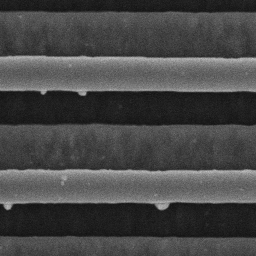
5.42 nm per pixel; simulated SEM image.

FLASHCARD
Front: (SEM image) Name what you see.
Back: lines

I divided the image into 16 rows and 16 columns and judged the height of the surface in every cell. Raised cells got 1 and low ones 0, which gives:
0000000000000000
1111111111111111
1111111111111111
1111111111111111
1111111111111111
1111111111111111
0000000000000000
0000000000000000
1111111111111111
1111111111111111
1111111111111111
1111111111111111
1111111111111111
0000000000000000
0000000000000000
1111111111111111